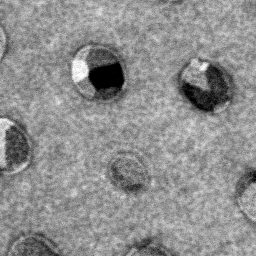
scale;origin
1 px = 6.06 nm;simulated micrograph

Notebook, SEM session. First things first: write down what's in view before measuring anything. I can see raised bodies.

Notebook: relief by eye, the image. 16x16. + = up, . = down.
................
................
................
.....++.........
.....+++....++..
.....+++...+++..
............++..
................
++..............
++..............
+......++.......
.......++......+
...............+
................
................
.++.....++......